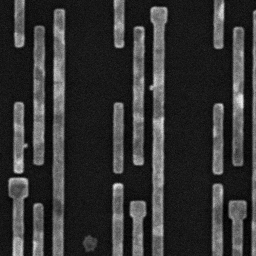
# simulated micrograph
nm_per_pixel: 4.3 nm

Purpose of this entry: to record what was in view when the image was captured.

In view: wiring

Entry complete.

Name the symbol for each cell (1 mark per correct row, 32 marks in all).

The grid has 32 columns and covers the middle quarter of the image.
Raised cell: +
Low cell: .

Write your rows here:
..................++...++.......
..................++...++.......
..................++...++.......
..................++...++.......
..................++...++.......
.................+++..+++.......
.................+++..+++.......
..................++...++.......
..................++...++.......
.................+++...++.......
.............++..+++...++.......
.............++..+++...++.......
.............++..+++...++.......
.............++..+++...++.......
.............++..+++...++.......
.............++..+++...++.......
.............++...++...++.......
.............++..+++...++.......
.............++..+++...++.......
.............++..+++...++.......
.............++..++....++.......
.............++..+++...++.......
.............++..+++..+++.......
.............++..+++..+++.......
.............++..+++..+++.......
.............++.......+++.......
.............++........++.......
......................+++.......
......................+++.......
......................+++.......
.............++........++.......
.............++........++.......